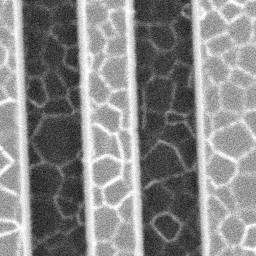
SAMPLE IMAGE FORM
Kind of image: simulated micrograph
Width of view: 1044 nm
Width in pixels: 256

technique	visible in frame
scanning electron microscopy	one or a few lines or trenches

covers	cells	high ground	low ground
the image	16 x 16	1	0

1000011100001111
1000011100001111
1000011100001111
1000011100001111
1000011100001111
1000011100001111
1000011100001111
1000011100001111
1000011100000111
1000011100000111
1100011100000111
1100001110000111
1100001110000111
1100001110000111
1100001110000111
1100001110000111